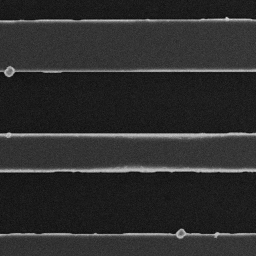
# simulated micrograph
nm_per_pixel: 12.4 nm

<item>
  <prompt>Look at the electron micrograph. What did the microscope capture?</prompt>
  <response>lines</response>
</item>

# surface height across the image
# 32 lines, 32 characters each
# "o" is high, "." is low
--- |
................................
................................
.........................ooooooo
oooooooooooooooooooooooooooooooo
oooooooooooooooooooooooooooooooo
oooooooooooooooooooooooooooooooo
oooooooooooooooooooooooooooooooo
oooooooooooooooooooooooooooooooo
oooooooooooooooooooooooooooooooo
................................
................................
................................
................................
................................
................................
................................
................................
oooooooooooooooooooooooooooooooo
oooooooooooooooooooooooooooooooo
oooooooooooooooooooooooooooooooo
oooooooooooooooooooooooooooooooo
................................
................................
................................
................................
................................
................................
................................
................................
oooooooooooooooooooooooooooooooo
oooooooooooooooooooooooooooooooo
oooooooooooooooooooooooooooooooo